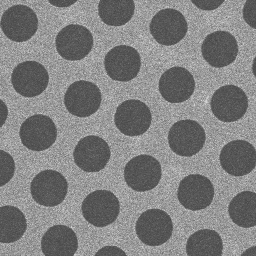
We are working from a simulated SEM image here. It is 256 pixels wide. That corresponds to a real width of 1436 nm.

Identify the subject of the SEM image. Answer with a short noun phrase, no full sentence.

a regular array of holes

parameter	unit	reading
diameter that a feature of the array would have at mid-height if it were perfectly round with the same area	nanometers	210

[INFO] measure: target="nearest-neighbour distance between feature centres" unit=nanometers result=306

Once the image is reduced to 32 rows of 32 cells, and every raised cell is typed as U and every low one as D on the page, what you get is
UUUUUUDDDUUUDDDDDUUUUUUUDDDDUUUD
UDDDUUUUUUUUDDDDDUUUDDUUUUUUUUDD
DDDDDUUUUUUUUDDDUUUDDDDUUUUUUUUD
DDDDDUUUDDDUUUUUUUUDDDDUUUUUUUUU
UDDDUUUDDDDDUUUUUUUDDDDUUUDDDUUU
UUUUUUUDDDDDUUUUUUUUDDUUUDDDDDUU
UUUUUUUDDDDUUUDDDUUUUUUUUDDDDDUU
UUUUUUUUDDUUUDDDDDUUUUUUUUDDDUUU
UUDDDDUUUUUUUDDDDDUUUDDUUUUUUUUU
UDDDDDUUUUUUUUDDDUUUDDDDUUUUUUUU
UUDDDDUUUDDDUUUUUUUUDDDDUUUUUUUU
UUDDDUUUDDDDDUUUUUUUDDDDUUUDDDUU
UUUUUUUUDDDDDUUUDUUUUDDUUUDDDDDU
DUUUUUUUDDDDUUUDDDDUUUUUUUDDDDDU
DUUUDDUUUDDUUUDDDDDUUUUUUUUDDDUU
UUUDDDDUUUUUUUDDDDDUUUDDDUUUUUUU
UUDDDDDUUUUUUUUDDDUUUDDDDDUUUUUU
UUUDDDDUUUDDDUUUUUUUUDDDDDUUUUUU
UUUDDDUUUDDDDDUUUUUUUDDDDUUUDDDD
DUUUUUUUUDDDDDUUUDDUUUUDUUUDDDDD
DDUUUUUUUUDDDUUUDDDDUUUUUUUUDDDD
DDUUUDDUUUUDUUUDDDDDUUUUUUUUDDDU
DUUUDDDDUUUUUUUUDDDDUUUDDDUUUUUU
UUUUDDDDUUUUUUUUDDDUUUDDDDDUUUUU
UUUUDDDDUUUDDDUUUUUUUUDDDDDUUDDD
UUUUUDDUUUDDDDDUUUUUUUUDDDUUUDDD
DDDUUUUUUUDDDDDUUUDDDUUUUUUUUDDD
DDDUUUUUUUUDDDUUUDDDDUUUUUUUUDDD
DDDUUUDDDUUUUUUUUDDDDDUUUUUUUUUU
DDDUUDDDDDUUUUUUUDDDDUUUDDDUUUUU
UUUUUDDDDDUUUUUUUUDDUUUDDDDDUUUU
UUUUUDDDDUUUDDDDUUUUUUUDDDDDUUDD